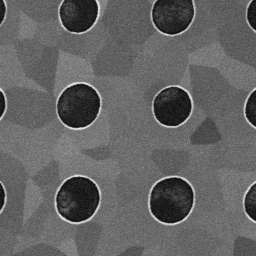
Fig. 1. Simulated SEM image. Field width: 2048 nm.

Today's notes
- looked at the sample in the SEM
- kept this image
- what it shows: holes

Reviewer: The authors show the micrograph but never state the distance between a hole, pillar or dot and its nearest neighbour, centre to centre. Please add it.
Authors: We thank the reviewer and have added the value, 748 nm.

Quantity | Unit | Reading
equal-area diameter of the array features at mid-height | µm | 0.36